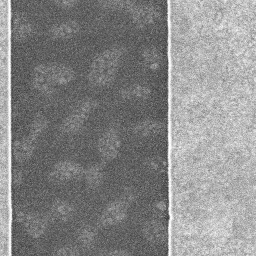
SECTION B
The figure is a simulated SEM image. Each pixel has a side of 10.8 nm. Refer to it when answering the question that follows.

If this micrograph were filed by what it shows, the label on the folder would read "one or a few lines or trenches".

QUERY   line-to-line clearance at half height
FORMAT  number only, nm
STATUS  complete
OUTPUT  1730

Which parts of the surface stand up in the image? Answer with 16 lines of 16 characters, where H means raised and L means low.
HLLLLLLLLLLHHHHH
HLLLLLLLLLLHHHHH
HLLLLLLLLLLHHHHH
HLLLLLLLLLLHHHHH
HLLLLLLLLLLHHHHH
HLLLLLLLLLLHHHHH
HLLLLLLLLLLHHHHH
HLLLLLLLLLLHHHHH
HLLLLLLLLLLHHHHH
HLLLLLLLLLLHHHHH
HLLLLLLLLLLHHHHH
HLLLLLLLLLLHHHHH
HLLLLLLLLLLHHHHH
HLLLLLLLLLLHHHHH
HLLLLLLLLLLHHHHH
HLLLLLLLLLLHHHHH